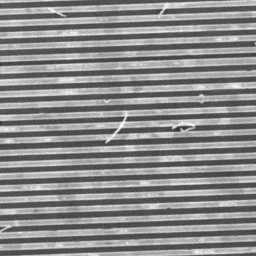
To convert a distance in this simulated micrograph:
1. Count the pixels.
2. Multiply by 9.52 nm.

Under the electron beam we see parallel lines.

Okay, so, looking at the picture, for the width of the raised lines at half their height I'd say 52.3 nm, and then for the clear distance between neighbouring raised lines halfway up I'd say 6.49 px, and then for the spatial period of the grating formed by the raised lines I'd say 112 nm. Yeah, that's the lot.